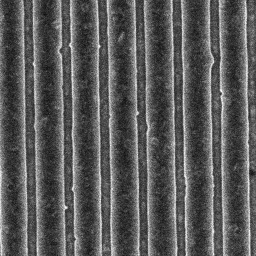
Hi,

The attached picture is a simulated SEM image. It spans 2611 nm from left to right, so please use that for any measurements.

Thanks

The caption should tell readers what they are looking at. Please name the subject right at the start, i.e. parallel lines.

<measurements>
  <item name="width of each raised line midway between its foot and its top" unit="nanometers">278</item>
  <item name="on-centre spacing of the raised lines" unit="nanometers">379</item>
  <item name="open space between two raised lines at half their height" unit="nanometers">99.5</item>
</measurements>